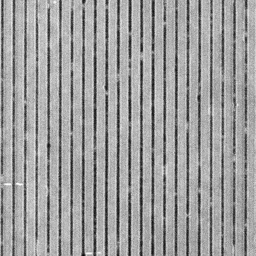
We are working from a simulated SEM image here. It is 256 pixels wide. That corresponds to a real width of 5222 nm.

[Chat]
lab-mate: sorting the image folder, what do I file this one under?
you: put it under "parallel lines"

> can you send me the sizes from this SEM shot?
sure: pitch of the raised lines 0.237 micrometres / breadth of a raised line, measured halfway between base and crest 91.8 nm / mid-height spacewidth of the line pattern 143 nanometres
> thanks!